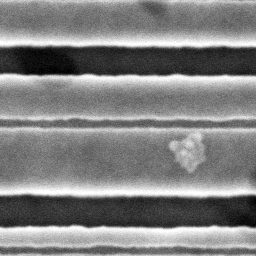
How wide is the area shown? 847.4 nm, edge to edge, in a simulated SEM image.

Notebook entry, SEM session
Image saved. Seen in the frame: lines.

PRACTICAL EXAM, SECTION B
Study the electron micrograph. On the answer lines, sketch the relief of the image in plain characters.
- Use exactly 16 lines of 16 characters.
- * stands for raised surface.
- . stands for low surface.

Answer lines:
****************
****************
****************
................
................
****************
****************
****************
****************
****************
****************
****************
................
................
****************
****************